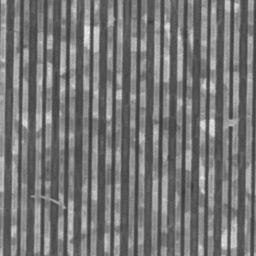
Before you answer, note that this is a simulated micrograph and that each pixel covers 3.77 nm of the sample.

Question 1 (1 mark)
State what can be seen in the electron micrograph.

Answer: parallel lines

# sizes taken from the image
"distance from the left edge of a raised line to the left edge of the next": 44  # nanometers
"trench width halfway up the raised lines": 29.2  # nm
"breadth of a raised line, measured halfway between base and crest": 0.0193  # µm